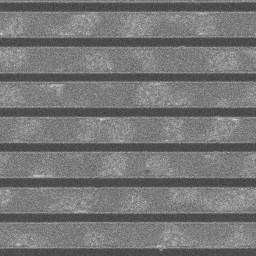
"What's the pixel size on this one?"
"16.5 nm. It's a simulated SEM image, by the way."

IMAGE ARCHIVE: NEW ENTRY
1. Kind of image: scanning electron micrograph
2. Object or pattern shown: parallel lines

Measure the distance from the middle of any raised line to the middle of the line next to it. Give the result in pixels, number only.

35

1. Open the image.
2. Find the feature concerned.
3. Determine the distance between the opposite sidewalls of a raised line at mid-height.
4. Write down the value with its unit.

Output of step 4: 175 nanometres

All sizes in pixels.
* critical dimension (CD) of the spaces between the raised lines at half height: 24.4